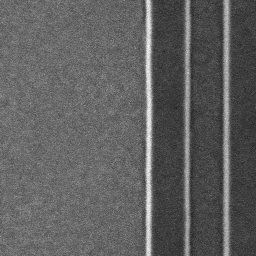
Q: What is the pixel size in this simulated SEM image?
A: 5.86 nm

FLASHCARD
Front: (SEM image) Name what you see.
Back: one or a few lines or trenches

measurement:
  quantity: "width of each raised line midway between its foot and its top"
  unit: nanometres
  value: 235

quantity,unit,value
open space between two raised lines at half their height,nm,220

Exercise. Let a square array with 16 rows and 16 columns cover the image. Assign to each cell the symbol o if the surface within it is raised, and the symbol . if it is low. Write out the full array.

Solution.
.........ooo..oo
.........ooo..oo
.........ooo..oo
.........ooo..oo
.........ooo..oo
.........ooo..oo
.........ooo..oo
.........ooo..oo
.........ooo..oo
.........ooo..oo
.........ooo..oo
.........ooo..oo
.........ooo..oo
.........ooo..oo
.........ooo..oo
.........ooo..oo